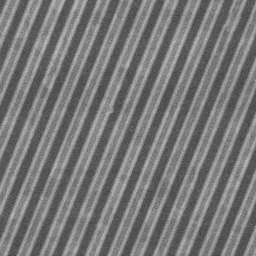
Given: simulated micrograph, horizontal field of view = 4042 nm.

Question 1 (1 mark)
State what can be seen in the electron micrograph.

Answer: parallel lines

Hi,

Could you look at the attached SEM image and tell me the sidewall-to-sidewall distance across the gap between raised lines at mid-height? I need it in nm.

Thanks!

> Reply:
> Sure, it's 176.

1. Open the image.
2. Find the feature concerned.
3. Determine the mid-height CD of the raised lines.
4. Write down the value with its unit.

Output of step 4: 9.27 px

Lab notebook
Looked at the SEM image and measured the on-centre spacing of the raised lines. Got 332 nm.